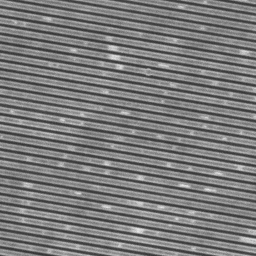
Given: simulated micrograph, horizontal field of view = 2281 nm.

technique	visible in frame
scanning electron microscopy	parallel lines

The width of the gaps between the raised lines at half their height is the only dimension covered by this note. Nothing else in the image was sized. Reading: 35.2 nm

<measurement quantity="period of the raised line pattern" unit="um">0.0781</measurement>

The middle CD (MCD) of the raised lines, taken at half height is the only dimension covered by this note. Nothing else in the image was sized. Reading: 43.9 nm